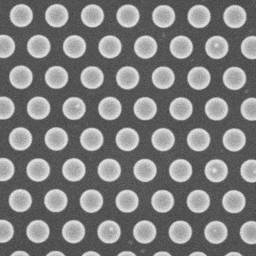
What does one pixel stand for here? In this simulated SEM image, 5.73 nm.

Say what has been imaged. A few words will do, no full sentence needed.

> an array of small figures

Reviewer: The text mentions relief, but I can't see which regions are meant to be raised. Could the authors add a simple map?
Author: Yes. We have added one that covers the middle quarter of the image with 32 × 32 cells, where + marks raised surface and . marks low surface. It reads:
................................
.....++++.....++++.....++++.....
+...++++++...+++++....+++++....+
+...++++++...++++++...++++++...+
+...++++++...++++++...+++++....+
.....++++.....++++.....++++.....
................................
................................
.+++......++........+.......++..
+++++....+++++....+++++....+++++
+++++....+++++....+++++...++++++
+++++....+++++....+++++...++++++
+++++....+++++....+++++....+++++
.+++......+++......+++......+++.
................................
................................
.....++++.....+++......+++......
+...+++++....+++++....+++++....+
+...++++++...++++++...+++++....+
+...++++++...++++++...+++++....+
.....++++.....++++....+++++....+
......++.......++.......++......
................................
................................
+++++....++++.....++++.....++++.
+++++....+++++....+++++....+++++
+++++....+++++...++++++...++++++
+++++....+++++....+++++....+++++
.+++.....++++.....++++.....++++.
................................
................................
......+.........................